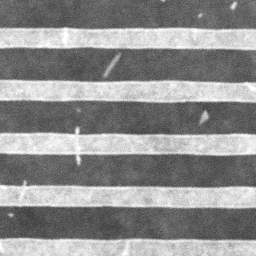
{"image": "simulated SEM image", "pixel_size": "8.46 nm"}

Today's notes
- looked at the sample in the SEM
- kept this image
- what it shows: wiring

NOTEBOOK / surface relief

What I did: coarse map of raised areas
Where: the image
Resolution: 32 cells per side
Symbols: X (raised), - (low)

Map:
--------------------------------
--------------------------------
--------------------------------
--------------------------------
XXXXXXXXXXXXXXXXXXXXXXXXXXXXXXXX
XXXXXXXXXXXXXXXXXXXXXXXXXXXXXXXX
--------------------------------
--------------------------------
--------------------------------
--------------------------------
XXXXXXXXXXXXXXXXXXXXXXXXXXX---X-
XXXXXXXXXXXXXXXXXXXXXXXXXXXXXXXX
-----XXXX----XXXXXXXXXXXXXXXXXXX
--------------------------------
-------------------------X------
--------------------------------
--------------------------------
XXXXXXXXXXXXXXXXXXXXXXXXXXXXXXXX
XXXXXXXXXXXXXXXXXXXXXXXXXXXXXXXX
--------------------------------
--------------------------------
--------------------------------
--------------------------------
XXXXXXXXXXXXXXXXXXXX--------XXXX
XXXXXXXXXXXXXXXXXXXXXXXXXXXXXXXX
XXXXXXXXXXXXXXXXXXXXXXXXXXXXXXXX
--------------------------------
--------------------------------
--------------------------------
--------------------------------
XXXXXXXXXXXXXXXXXXXXXXXXXXXXXXXX
XXXXXXXXXXXXXXXXXXXXXXXXXXXXXXXX